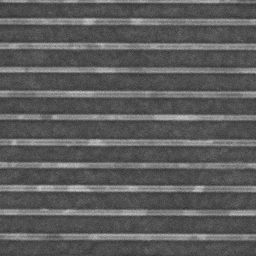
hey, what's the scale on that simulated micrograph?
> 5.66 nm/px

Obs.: parallel lines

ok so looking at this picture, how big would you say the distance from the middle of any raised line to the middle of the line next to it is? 136 nanometers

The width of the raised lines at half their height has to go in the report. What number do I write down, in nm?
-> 26.2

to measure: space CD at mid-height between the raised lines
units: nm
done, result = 108